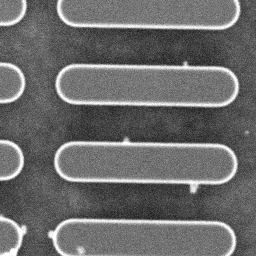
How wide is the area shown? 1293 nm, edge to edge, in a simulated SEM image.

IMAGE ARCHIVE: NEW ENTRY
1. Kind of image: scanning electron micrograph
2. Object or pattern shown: groups of lines, slits or small figures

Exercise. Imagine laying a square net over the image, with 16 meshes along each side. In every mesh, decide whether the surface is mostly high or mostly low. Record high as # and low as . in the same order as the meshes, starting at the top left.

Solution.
##..###########.
#...##########..
................
................
#...##########..
#...###########.
........######..
................
................
#...##########..
#...###########.
................
................
................
#..###########..
#...###########.